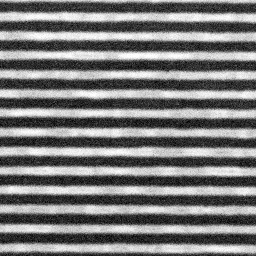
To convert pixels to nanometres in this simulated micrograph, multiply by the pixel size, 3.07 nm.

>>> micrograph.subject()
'parallel lines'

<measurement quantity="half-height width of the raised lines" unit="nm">23.8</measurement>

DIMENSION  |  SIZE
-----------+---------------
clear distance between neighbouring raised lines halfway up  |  0.0361 um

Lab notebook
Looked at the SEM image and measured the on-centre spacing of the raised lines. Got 0.0592 µm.